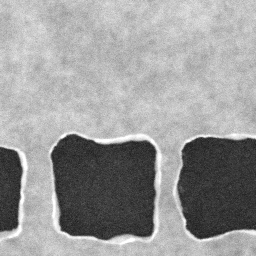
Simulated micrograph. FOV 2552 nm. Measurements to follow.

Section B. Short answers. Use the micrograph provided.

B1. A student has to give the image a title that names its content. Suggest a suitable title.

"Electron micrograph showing holes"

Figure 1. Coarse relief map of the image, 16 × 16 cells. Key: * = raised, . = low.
****************
****************
****************
****************
****************
****************
****************
****************
****.***********
.**.......*.....
.**.......*.....
.**.......*.....
.**.......*.....
.***......*.....
.***......**..**
****************